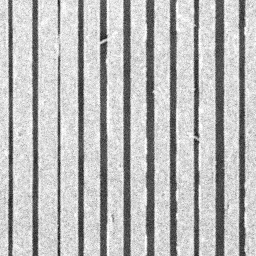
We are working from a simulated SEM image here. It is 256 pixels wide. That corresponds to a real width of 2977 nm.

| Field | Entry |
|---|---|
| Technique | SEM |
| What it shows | parallel lines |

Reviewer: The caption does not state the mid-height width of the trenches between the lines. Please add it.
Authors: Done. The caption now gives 7.25 px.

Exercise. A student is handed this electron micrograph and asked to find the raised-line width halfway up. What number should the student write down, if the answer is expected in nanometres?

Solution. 169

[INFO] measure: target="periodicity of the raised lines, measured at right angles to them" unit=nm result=270